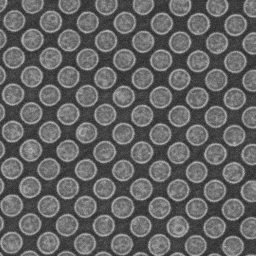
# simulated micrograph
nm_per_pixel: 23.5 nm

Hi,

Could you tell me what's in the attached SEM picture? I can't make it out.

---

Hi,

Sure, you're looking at a regular array of raised bodies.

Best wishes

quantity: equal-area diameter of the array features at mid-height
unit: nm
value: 474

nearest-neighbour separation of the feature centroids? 609 nm